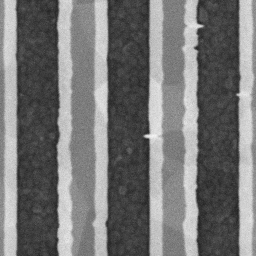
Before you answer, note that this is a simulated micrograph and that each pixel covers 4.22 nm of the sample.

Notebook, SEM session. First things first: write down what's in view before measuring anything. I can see one or a few lines or trenches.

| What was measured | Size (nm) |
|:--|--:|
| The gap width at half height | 231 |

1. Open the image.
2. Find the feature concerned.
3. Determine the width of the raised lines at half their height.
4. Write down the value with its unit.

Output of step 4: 150 nm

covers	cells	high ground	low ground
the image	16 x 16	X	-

X---XX----XX---X
X---XX----XX---X
X---XX----XX---X
X---XX----XX---X
X---XX----XX---X
X---XX----XX---X
X---XX----XX---X
X---XX----XX---X
X---XX----XX---X
X---XX----XX---X
X---XX----XX---X
X---XX----XX---X
X---XX----XX---X
X---XX----XX---X
X---XX----XX---X
X---XX----XX---X